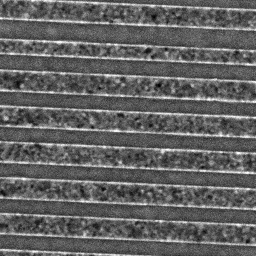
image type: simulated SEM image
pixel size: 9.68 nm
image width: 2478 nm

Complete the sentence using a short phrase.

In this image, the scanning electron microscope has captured parallel lines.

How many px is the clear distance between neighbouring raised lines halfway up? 15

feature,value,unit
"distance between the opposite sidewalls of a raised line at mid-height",201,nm